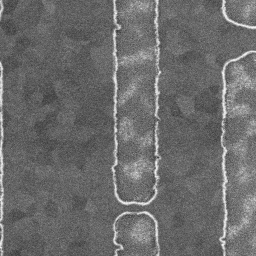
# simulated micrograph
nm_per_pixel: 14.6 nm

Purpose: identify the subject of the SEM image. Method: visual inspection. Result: one or a few lines or trenches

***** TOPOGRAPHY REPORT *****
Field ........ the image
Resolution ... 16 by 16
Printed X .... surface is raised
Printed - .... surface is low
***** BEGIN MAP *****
XXXXXXX---XXXX--
XXXXXXX---XXXXX-
XXXXXXX---XXXXXX
XXXXXXX---XXXXX-
XXXXXXX---XXXX--
XXXXXXX---XXXX--
XXXXXXX---XXXX--
XXXXXXX---XXXX--
XXXXXXX---XXXX--
XXXXXXX---XXXX--
XXXXXXX---XXXX--
XXXXXXX---XXXX--
XXXXXXXX-XXXXX--
XXXXXXXX-XXXXX--
XXXXXXX---XXXX--
XXXXXXX---XXXX--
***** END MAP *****